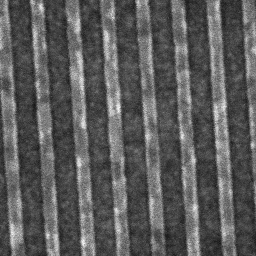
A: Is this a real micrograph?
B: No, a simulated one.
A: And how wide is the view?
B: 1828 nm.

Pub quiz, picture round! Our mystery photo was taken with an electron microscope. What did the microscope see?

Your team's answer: parallel lines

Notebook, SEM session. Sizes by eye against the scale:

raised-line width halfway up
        88.2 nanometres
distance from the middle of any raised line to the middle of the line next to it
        0.251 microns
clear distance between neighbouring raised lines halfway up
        163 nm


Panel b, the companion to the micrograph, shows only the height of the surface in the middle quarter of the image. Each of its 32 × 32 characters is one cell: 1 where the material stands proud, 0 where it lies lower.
00110000001110000001110000001110
00111000001110000001110000001110
00111000000110000000110000001110
00111000000110000001110000001110
00111000000111000001110000001110
00111000000111000001110000000110
00111000000111000000110000000110
00111000000111000000111000000110
00111000000111000000111000000111
00111000000111000000111000000111
00111000000111000000111000000110
00111000000111000000111000000111
00111000000111000000111000000111
00111000000111000000111000000111
00111000000111000000111000000111
00011000000111000000111000000111
00011000000111000000111000000111
00011100000111000000011000000111
00011100000011000000011000000111
00011000000011000000011000000111
00011100000011100000011000000111
00011100000011100000011000000011
00011100000011100000011000000011
00011100000011100000011100000111
00011100000011100000011100000011
00011100000011100000011100000011
00001100000011100000011100000011
00011100000011100000011100000011
00011100000011100000011100000011
00001110000011100000011100000011
00001110000011100000011100000011
00001100000011100000011100000011